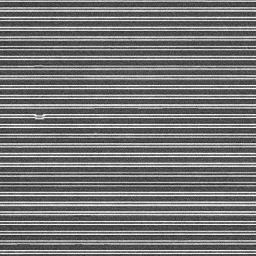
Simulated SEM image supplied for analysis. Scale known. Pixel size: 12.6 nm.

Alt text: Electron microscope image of parallel lines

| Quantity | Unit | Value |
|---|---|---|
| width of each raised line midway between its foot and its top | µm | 0.0441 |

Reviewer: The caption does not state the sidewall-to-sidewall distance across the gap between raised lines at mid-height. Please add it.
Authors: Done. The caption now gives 78.7 nm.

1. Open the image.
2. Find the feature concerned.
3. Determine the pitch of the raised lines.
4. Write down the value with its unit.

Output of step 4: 9.72 px